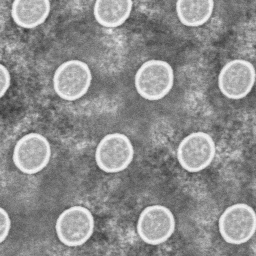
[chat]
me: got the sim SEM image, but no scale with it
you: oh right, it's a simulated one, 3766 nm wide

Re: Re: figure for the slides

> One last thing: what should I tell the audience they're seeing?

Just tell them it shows a regular array of raised bodies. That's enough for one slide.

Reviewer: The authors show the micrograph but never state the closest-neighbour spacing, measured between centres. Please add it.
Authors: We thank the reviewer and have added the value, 1200 nanometres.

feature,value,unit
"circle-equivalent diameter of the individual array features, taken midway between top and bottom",0.526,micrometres